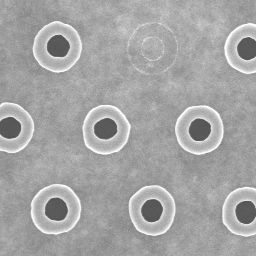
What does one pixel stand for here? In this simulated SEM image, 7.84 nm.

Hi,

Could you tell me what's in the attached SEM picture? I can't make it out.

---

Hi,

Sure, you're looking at ring-shaped raised bodies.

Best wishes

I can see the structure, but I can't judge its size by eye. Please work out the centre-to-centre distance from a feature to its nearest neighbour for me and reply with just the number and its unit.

0.731 um